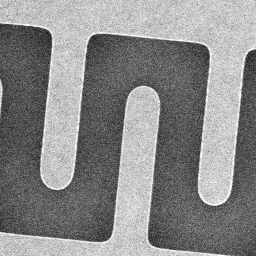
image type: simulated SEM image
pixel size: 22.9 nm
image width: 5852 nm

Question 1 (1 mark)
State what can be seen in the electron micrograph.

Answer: groups of lines, slits or small figures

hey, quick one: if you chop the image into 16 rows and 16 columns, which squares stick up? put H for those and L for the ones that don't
HHHHHHHHHHHHHHHH
HHHHHHHHHHHHHHHH
LLLHHHLLLLLHHHHH
LLLHHLLLLLLLLHHL
LLLHHLLLLLLLLHHL
LLLHHLLLLLLLLHHL
LLLHHLLLHHLLLHHL
LLLHHLLLHHLLLHHL
LLLHHLLLHHLLLHHL
LLLHHLLLHHLLLHHL
LLLHHLLHHHLLHHHL
LLLHLLLHHHLLHHLL
LLLLLLLHHLLLLHLL
LLLLLLLHHLLLLLLL
LLLLLLLHHLLLLLLL
HHHHHHHHHHLLLLLL